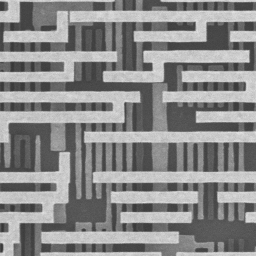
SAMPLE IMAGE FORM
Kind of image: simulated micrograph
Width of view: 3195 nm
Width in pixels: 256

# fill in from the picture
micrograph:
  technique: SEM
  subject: wiring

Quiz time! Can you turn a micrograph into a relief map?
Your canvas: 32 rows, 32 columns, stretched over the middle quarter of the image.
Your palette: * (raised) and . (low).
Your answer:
**....................***.......
**....................***.......
**........***************.....**
**........***************.....**
.................*******......**
................................
................................
*******************......*******
*******************......*******
***************.***......*......
............***.................
............***.................
***************.................
***************.................
***************.................
................................
................................
.....***************************
.....***************************
.....*************************..
................................
................................
*...............................
*...............................
*...............................
*...............................
*...............................
*......*************************
*......*************************
*......*************************
*...............................
*...............................